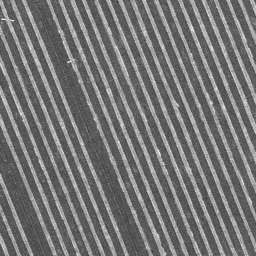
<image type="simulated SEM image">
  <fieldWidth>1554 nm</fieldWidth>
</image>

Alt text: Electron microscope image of parallel lines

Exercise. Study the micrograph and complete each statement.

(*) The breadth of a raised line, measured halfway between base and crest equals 21.8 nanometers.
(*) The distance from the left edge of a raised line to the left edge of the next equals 67.5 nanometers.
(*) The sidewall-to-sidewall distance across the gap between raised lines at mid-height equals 7.99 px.